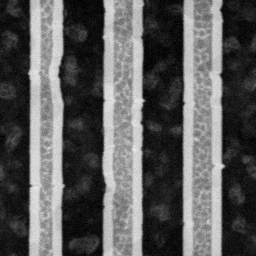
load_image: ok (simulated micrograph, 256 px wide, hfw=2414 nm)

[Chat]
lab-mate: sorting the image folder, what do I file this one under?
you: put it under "one or a few lines or trenches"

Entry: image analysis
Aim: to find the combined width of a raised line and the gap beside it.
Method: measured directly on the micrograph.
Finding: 737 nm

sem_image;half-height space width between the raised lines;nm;481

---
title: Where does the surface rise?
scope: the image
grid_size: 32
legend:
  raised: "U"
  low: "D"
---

DDDDDUUDDDDDDDUUUDDDDDDDUUUDDDDD
DDDDUUUDDDDDDDUUUDDDDDDDUUUDDDDD
DDDDUUUDDDDDDDUUUDDDDDDDUUUDDDDD
DDDDUUUDDDDDDDUUUDDDDDDDUUUDDDDD
DDDDUUUDDDDDDDUUUDDDDDDDUUUDDDDD
DDDDUUUDDDDDDDUUUDDDDDDDUUUDDDDD
DDDDUUUDDDDDDDUUUDDDDDDDUUUDDDDD
DDDDUUUDDDDDDDUUUDDDDDDDUUUDDDDD
DDDDUUUDDDDDDDUUUDDDDDDDUUUDDDDD
DDDDUUUDDDDDDDUUUDDDDDDDUUUDDDDD
DDDDUUUDDDDDDDUUUDDDDDDDUUUDDDDD
DDDDUUUDDDDDDDUUUDDDDDDDUUUDDDDD
DDDDUUUDDDDDDDUUUDDDDDDDUUUDDDDD
DDDDUUUDDDDDDDUUUDDDDDDDUUUDDDDD
DDDDUUUDDDDDDDUUUDDDDDDDUUUDDDDD
DDDDUUUDDDDDDDUUUDDDDDDDUUUDDDDD
DDDDUUUDDDDDDDUUUDDDDDDDUUUDDDDD
DDDDUUUDDDDDDDUUUDDDDDDUUUUDDDDD
DDDDUUUDDDDDDDUUUDDDDDDUUUUDDDDD
DDDDUUUDDDDDDDUUUDDDDDDDUUUDDDDD
DDDDUUUDDDDDDDUUUDDDDDDDUUUDDDDD
DDDDUUUDDDDDDDUUUDDDDDDUUUUDDDDD
DDDDUUUDDDDDDDUUUDDDDDDUUUUDDDDD
DDDDUUUDDDDDDDUUUDDDDDDUUUUDDDDD
DDDDUUUDDDDDDDUUUDDDDDDUUUUDDDDD
DDDDUUUDDDDDDDUUUDDDDDDUUUUDDDDD
DDDDUUUDDDDDDDUUUDDDDDDUUUUDDDDD
DDDDUUUDDDDDDDUUUDDDDDDDUUUDDDDD
DDDDUUUDDDDDDDUUUDDDDDDDUUUDDDDD
DDDDUUUDDDDDDDUUUDDDDDDDUUUDDDDD
DDDDUUUDDDDDDDUUUDDDDDDDUUUDDDDD
DDDDUUUDDDDDDDUUUDDDDDDDUUUDDDDD